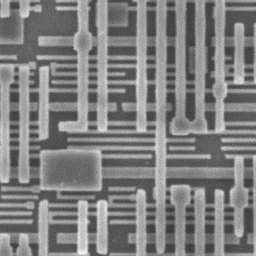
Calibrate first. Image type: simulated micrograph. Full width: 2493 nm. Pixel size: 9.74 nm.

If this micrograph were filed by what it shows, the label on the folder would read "wiring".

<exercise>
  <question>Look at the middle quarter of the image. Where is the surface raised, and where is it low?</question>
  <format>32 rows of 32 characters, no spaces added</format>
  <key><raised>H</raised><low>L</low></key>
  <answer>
LLLHHHLLLHHLLLLLLLHHLLLHHLLLHHLL
LLLHHHLLLHHLLLLLLLHHLLLHHLLLHHLL
LLLHHHLLLHHLLLLLLLHHLLLHHLLLHHLL
LLLHHHLLLHHLLLLLLLHHLLLHHLLLHHLL
LLLHHHLLLHHLLLLLLLHHLLLHHLLLHHLL
LLLLHHLLLHHLLLLLLLHHLLLHHLLLHHLL
LLLLHHLLLHHLLLLLLLHHLLLHHLLLHHLL
LLLLHHLLLHHLLLLLLLHHLLLHHLLLHHLL
LLLLHHLLLHHLLLLLLLHHLLLHHLLLHHLL
LLLLHHLLLHHLLLLLLLHHLLLHHLLLHHLL
LLLLHHLLLHHLLLLLLLHHLLLHHLLLHHLL
LLLLHHLLLHHLLLLLLLHHLLLHHLLLHHLL
LLLLHHLLLHHLLLLLLLHHLLLHHLLLHHLL
LLLLHHLLLHHLLLLLLLHHLLLHHLLHHHHL
LLLHHHLLLHHLLLLLLLHHLLLHHLLHHHHH
HHHHHHLLLHHLLLLLLLHHLLLHHLLHHHHH
HHHHHHLLLHHLLLLLLLHHLLLHHLLHHHHH
LLLLLLLLLLLLLLLLLLLLLLLHHLLHHHHL
LLLLLLLLLLLLLLLLLLLLLLLHHLLLLLLL
LLLLLLLLLLLLLLLLLLLLLLLHHLLLLLLL
LLLLLLLLLLLLLLLLLLLLLLLHHLLLLLLL
HHHLLLLLLLLLLLLLLLLLLLLHHLLLLLLL
HHHHHHHHHLLLLLLLLLLLLLLHHLLLLLLL
HHHHHHHHHLLLLLLLLLLLLLLHHLLLLLLL
HHHHHHHHHLLLLLLLLLLLLLLHHLLLLLLL
HHHHHHHHHLLLLLLLLLLLLLLHHLLLLLLL
HHHHHHHHHLLLLLLLLLLLLLLHHLLLLLLL
HHHHHHHHHLLLLLLLLLLLLLLHHLLLLLLL
HHHHHHHHHLLLLLLLLLLLLLLHHLLLLLLL
HHHHHHHHHLLLLLLLLLLLLLLHHLLLLLLL
HHHHHHHHHLLLLLLLLLLLLLLHHLLHHHHL
LHHHHHHHHLLLLLLLLLLHLLLHHLLHHHHL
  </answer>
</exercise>